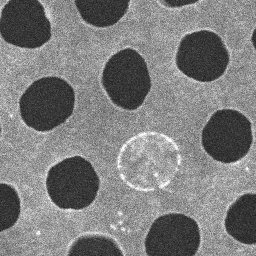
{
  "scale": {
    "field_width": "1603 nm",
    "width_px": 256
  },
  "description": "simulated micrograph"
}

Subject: holes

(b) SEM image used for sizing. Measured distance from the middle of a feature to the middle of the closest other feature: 522 nm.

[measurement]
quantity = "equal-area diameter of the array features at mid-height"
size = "0.334 micrometres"